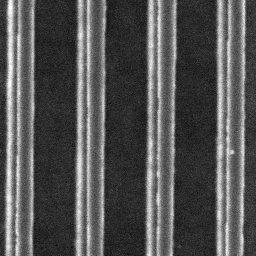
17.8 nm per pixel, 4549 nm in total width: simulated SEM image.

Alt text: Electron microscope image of lines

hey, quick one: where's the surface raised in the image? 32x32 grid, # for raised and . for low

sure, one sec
..##......###......###......###.
.###......###......###......###.
.###......###......###......###.
.###......###......###......###.
.###......###......###......###.
.###......###......###......##..
.###......###......###......##..
.###......###......###......##..
.###......###......###......##..
.###......###......###......##..
.###......###......###......##..
.###......###......###......##..
.###......###......###......##..
.###......###......###......##..
.###......###......###......##..
.###......###......###......##..
.###......###......###......##..
.###......###......###......##..
.###......###......###......##..
.###......###......###......##..
.###......###......###......##..
.###......###......###......##..
.###......###......###......##..
.###......###......###......##..
.###......###......###......##..
.###......###......###......##..
.###......###......###......##..
.###......###......###......##..
.###......###......##.......##..
.###......###......##.......##..
.###......###......##.......##..
.###......###......##.......##..